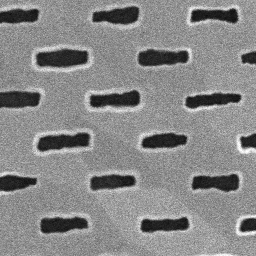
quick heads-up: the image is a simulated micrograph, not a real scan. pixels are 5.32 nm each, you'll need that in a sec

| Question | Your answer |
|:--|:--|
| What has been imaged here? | a regular array of holes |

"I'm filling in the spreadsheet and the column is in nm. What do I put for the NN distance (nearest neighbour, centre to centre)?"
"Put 336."